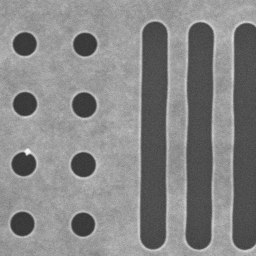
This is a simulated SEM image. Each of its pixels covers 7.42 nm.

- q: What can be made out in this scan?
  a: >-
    groups of lines, slits or small figures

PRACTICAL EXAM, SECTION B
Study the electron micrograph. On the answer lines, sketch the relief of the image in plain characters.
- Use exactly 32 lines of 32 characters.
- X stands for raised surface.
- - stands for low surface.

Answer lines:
XXXXXXXXXXXXXXXXXXXXXXXXXXXXXXXX
XXXXXXXXXXXXXXXXXXXXXXXXXXXXXXXX
XXXXXXXXXXXXXXXXXXXXXXXXXXXXXXXX
XXXXXXXXXXXXXXXXXX---XXX--XXXX--
XX--XXXXXX--XXXXXX---XXX---XX---
XX---XXXX---XXXXXX---XX----XX---
XX--XXXXXX--XXXXXX---XX----XX---
XXXXXXXXXXXXXXXXXX---XX----XX---
XXXXXXXXXXXXXXXXXX---XX----XX---
XXXXXXXXXXXXXXXXXX---XX----XX---
XXXXXXXXXXXXXXXXXX---XX----XX---
XXXXXXXXXXXXXXXXXX---XX----XX---
XX--XXXXX---XXXXXX---XX----XX---
XX--XXXXX---XXXXXX---XX----XX---
XXXXXXXXXX-XXXXXXX---XX----XX---
XXXXXXXXXXXXXXXXXX---XX----XX---
XXXXXXXXXXXXXXXXXX---XX----XX---
XXXXXXXXXXXXXXXXXX---XX----XX---
XXXXXXXXXXXXXXXXXX---XX----XX---
XX--XXXXX---XXXXXX---XX----XX---
X---XXXXX---XXXXXX---XX----XX---
XX--XXXXX---XXXXXX---XX----XX---
XXXXXXXXXXXXXXXXXX---XX----XX---
XXXXXXXXXXXXXXXXXX---XX----XX---
XXXXXXXXXXXXXXXXX----XX----XX---
XXXXXXXXXXXXXXXXX----XX----XX---
XXXXXXXXXXXXXXXXX----XX----XX---
X---XXXXX---XXXXX----XX----XX---
X---XXXXX---XXXXX----XX----XX---
XXXXXXXXXX-XXXXXXX---XX----XX---
XXXXXXXXXXXXXXXXXX--XXXX--XXX---
XXXXXXXXXXXXXXXXXXXXXXXXXXXXXXXX